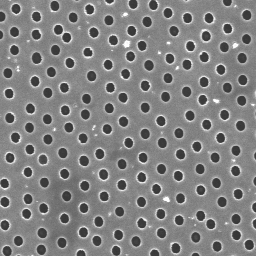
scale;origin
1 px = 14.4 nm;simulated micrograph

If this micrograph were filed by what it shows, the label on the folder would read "a regular array of holes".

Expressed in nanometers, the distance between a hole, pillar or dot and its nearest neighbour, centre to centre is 269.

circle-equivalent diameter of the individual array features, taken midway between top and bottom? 139 nm